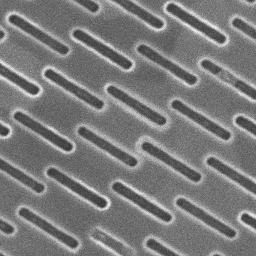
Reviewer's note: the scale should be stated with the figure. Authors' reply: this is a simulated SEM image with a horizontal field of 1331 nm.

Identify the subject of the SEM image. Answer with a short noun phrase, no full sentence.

a regular array of holes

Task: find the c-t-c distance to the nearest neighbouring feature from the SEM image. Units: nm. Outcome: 262